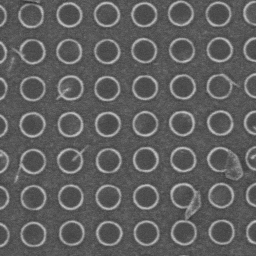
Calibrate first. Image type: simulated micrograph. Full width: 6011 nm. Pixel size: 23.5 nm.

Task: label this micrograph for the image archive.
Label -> a regular array of raised bodies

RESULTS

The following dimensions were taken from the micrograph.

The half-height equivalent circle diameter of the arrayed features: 559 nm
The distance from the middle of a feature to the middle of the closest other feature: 849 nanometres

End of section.